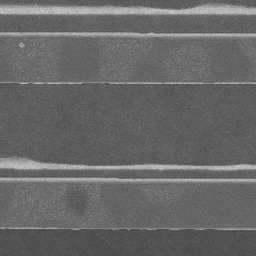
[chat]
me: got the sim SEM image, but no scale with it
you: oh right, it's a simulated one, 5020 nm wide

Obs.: lines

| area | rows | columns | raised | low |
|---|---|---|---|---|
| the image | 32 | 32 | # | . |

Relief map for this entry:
................................
................................
################################
################################
################################
################################
################################
################################
################################
################################
................................
................................
................................
................................
................................
................................
................................
................................
................................
................................
................................
################################
################################
################################
################################
################################
################################
################################
.###############################
................................
................................
................................